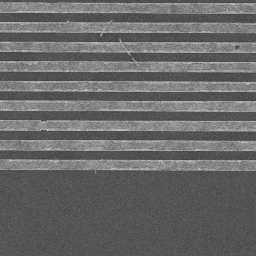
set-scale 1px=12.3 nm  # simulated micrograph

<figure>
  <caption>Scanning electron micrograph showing parallel lines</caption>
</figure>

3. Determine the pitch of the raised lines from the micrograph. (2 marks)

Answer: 19.6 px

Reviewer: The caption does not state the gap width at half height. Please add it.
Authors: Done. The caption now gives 118 nanometers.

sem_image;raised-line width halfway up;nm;124